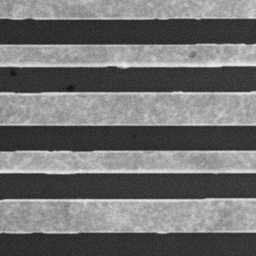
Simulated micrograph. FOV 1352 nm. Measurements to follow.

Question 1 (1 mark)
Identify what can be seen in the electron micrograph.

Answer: lines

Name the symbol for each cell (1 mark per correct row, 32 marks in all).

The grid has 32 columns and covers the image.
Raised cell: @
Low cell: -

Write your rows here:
@@@@@@@@@@@@@@@@@@@@@@@@@@@@@@@@
@@@@@@@@@@@@@@@@@@@@@@@@@@@@@@@@
--------------------------------
--------------------------------
--------------------------------
--------------------------------
@@@@@@@@@@@@@@@@@@@@@@@@@@@@@@@@
@@@@@@@@@@@@@@@@@@@@@@@@@@@@@@@@
--------------------------------
--------------------------------
--------------------------------
--------------------------------
@@@@@@@@@@@@@@@@@@@@@@@@@@@@@@@@
@@@@@@@@@@@@@@@@@@@@@@@@@@@@@@@@
@@@@@@@@@@@@@@@@@@@@@@@@@@@@@@@@
@@@@@@@@@@@@@@@@@@@@@@@@@@@@@@@@
--------------------------------
--------------------------------
--------------------------------
@@@@@@@@@@@@@@@@@@@@@@@@@@@@@@@@
@@@@@@@@@@@@@@@@@@@@@@@@@@@@@@@@
@@@@@@@@@@@@@@@@@@@@@@@@@@@@@@@@
--------------------------------
--------------------------------
--------------------------------
@@@@@@@@@@@@@@@@@@@@@@@@@@@@@@@@
@@@@@@@@@@@@@@@@@@@@@@@@@@@@@@@@
@@@@@@@@@@@@@@@@@@@@@@@@@@@@@@@@
@@@@@@@@@@@@@@@@@@@@@@@@@@@@@@@@
--------------------------------
--------------------------------
--------------------------------